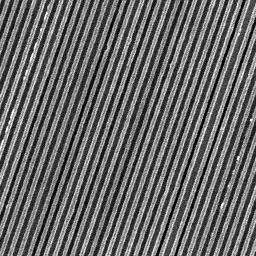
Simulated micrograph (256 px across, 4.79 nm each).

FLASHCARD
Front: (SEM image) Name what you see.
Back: parallel lines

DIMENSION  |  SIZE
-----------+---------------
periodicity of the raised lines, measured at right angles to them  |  40.5 nm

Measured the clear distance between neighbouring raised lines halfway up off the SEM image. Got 4.61 px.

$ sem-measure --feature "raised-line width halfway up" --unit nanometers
17.6